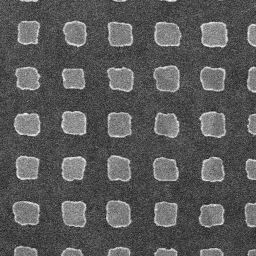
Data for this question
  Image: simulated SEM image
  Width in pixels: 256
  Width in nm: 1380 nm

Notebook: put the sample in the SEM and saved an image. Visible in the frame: a regular array of raised bodies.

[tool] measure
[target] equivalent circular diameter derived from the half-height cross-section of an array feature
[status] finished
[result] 0.136 micrometres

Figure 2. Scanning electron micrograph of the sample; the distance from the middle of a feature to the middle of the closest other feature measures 240 nm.